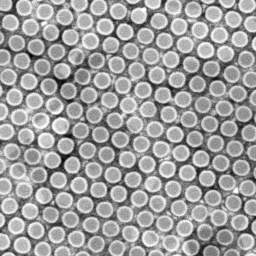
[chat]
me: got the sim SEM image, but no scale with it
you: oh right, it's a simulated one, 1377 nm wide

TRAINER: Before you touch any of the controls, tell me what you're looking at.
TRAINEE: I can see a regular array of raised bodies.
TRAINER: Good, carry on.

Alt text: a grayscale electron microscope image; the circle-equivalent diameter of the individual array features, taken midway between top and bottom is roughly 83.2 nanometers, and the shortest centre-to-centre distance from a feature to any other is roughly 0.108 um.